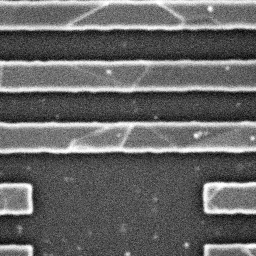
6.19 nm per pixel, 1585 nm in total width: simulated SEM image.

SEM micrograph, wiring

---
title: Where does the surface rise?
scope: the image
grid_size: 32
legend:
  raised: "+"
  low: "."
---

++++++++++++++++++++++++++++++++
++++++++++++++++++++++++++++++++
++++++++++++++++++++++++++++++++
+++++++++++.++....+++++++.......
................................
................................
................................
................................
++++++++++++++++++++++++++++++++
++++++++++++++++++++++++++++++++
++++++++++++++++++++++++++++++++
................................
................................
................................
................................
+.....+....++.++++++++++++++++++
++++++++++++++++++++++++++++++++
++++++++++++++++++++++++++++++++
++++++++++++++++++++++++++++++++
................................
................................
................................
................................
++++......................++++++
++++......................++++++
++++......................++++++
++++......................++++++
................................
................................
................................
................................
++++......................++++++